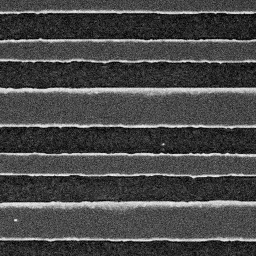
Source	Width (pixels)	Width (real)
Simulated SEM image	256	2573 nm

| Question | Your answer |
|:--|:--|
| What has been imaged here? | lines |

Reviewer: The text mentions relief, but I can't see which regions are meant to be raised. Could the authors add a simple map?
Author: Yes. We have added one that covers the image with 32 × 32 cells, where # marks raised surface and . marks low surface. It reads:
################################
################################
................................
................................
................................
################################
################################
################################
................................
................................
................................
################################
################################
################################
################################
################################
................................
................................
................................
################################
################################
################################
................................
................................
................................
##....##.#####.#################
################################
################################
################################
################################
................................
................................